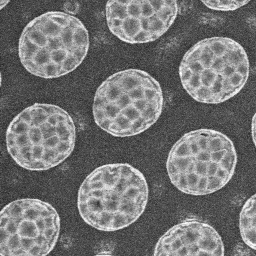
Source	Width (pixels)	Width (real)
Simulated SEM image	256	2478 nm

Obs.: raised bodies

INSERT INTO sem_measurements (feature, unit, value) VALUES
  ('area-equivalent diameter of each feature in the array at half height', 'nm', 639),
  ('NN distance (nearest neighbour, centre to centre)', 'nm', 901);